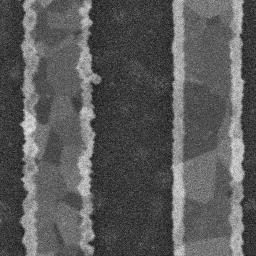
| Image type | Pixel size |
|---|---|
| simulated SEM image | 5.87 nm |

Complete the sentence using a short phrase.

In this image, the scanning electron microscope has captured one or a few lines or trenches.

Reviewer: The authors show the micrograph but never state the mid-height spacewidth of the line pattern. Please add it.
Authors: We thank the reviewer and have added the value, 89.1 pixels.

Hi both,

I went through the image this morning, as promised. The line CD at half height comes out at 356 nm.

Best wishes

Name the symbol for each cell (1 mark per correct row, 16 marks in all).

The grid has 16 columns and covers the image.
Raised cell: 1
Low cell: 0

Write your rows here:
0011110000011110
0011110000011110
0011100000011110
0011100000011110
0011110000011110
0011110000011110
0011100000011110
0011110000011110
0011110000011110
0011110000011110
0011100000011110
0011100000011110
0011100000011110
0011110000011110
0011110000011110
0011110000011110